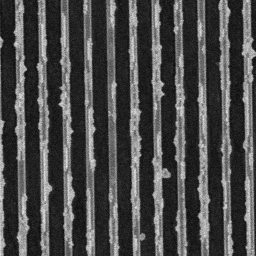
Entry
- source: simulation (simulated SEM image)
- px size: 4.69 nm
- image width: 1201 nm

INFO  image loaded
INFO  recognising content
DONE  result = parallel lines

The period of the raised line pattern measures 107 nm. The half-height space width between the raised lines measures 72.6 nm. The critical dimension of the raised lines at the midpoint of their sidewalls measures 6.87 pixels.